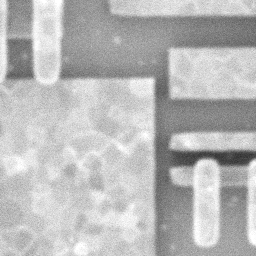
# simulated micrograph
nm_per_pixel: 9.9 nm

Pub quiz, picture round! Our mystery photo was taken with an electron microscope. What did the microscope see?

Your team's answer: wiring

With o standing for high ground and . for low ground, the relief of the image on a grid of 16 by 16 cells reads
..oo............
..oo............
..oo............
..oo............
..oo............
................
................
................
................
................
............oo..
............oo..
............oo..
............oo..
............oo..
................